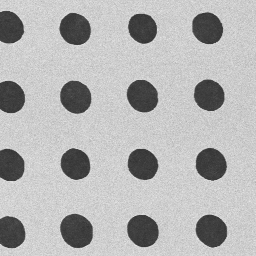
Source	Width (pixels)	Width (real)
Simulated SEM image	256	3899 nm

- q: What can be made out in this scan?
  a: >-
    a regular array of holes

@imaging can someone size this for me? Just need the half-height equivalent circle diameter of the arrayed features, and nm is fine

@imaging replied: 483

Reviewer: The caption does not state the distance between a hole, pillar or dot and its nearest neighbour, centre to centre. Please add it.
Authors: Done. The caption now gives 1010 nm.